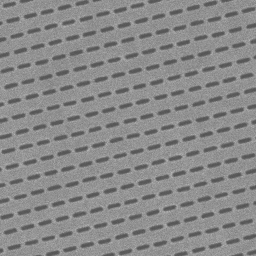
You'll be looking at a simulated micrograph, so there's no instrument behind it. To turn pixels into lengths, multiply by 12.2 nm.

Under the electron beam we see a regular array of holes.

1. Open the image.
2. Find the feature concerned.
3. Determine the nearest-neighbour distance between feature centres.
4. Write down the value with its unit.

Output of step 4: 188 nanometers